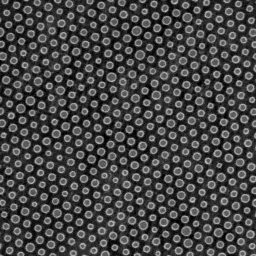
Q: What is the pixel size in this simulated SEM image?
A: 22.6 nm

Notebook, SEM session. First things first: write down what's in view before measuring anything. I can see a regular array of raised bodies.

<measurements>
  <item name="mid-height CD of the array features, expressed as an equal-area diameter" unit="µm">0.155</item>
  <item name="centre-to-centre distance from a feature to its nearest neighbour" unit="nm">268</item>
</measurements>